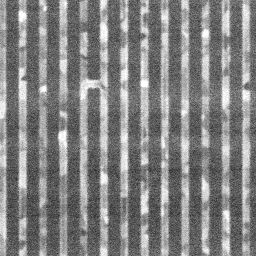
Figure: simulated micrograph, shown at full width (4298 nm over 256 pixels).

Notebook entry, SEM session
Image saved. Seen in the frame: parallel lines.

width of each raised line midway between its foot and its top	96.6	nm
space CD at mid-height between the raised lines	241	nm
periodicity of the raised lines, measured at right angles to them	0.341	µm